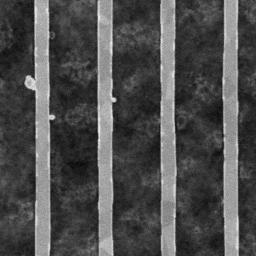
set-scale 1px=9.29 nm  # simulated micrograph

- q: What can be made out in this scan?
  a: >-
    one or a few lines or trenches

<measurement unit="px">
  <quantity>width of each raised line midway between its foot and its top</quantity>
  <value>13.4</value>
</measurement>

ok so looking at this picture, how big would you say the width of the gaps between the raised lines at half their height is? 460 nm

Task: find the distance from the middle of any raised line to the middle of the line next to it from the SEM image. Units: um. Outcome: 0.584